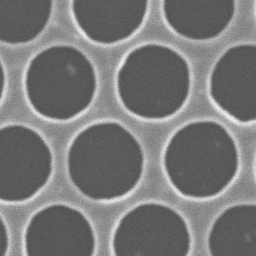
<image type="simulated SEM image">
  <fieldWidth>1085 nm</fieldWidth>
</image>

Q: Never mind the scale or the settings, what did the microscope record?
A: holes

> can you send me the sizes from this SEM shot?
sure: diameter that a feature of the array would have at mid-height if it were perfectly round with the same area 0.316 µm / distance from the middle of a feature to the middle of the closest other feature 386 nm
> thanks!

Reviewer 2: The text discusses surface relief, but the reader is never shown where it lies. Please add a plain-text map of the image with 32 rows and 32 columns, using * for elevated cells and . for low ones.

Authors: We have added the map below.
.......**.........**.........***
......***.........**.........***
......***.........***........***
......****.......*****......****
.....******.....*******....*****
********************************
*****.....******......******....
****.......*****.......****.....
****........***.........***.....
.**.........***.........**......
***.........***.........**......
***.........***.........**......
****........***........****.....
****.......*****.......*****....
******...********....********...
************...*********...*****
....******......******......****
.....****........****........***
......***.........***.........**
......***.........***.........**
......***.........***.........**
......***.........***.........**
......***........****........***
.....*****.......*****......****
....*******....*********..******
******************..************
*****.....******......******....
****.......****........****.....
.**........****........***......
.**.........**..........**......
.**.........**..........**......
.**.........**..........**......